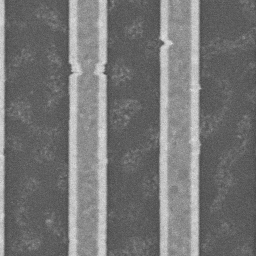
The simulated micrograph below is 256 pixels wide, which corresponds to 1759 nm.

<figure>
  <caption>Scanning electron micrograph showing one or a few lines or trenches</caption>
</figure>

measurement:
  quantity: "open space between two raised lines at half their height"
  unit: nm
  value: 434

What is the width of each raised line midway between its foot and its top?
201 nm